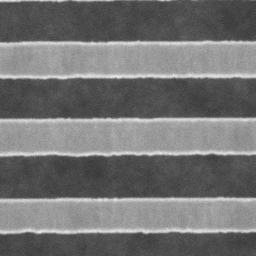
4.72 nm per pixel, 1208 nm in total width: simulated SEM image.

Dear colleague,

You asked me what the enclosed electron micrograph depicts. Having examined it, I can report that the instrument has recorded lines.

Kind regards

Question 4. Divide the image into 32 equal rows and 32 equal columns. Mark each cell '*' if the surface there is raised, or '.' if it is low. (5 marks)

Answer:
................................
................................
................................
................................
................................
********************************
********************************
********************************
********************************
*****************************.**
................................
................................
................................
................................
................................
********************************
********************************
********************************
********************************
................................
................................
................................
................................
................................
................................
********************************
********************************
********************************
********************************
................................
................................
................................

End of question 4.